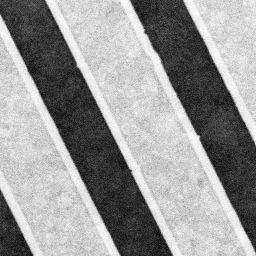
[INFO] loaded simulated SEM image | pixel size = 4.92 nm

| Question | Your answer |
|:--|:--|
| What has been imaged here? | one or a few lines or trenches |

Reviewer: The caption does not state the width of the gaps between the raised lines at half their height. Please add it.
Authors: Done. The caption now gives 0.27 microns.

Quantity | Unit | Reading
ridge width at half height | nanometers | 332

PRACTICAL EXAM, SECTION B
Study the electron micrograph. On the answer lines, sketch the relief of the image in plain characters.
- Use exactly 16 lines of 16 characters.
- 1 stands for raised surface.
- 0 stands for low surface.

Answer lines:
0001111100001111
0000111110000111
0000111110000111
1000011111000011
1000011111000011
1100001111100001
1100001111100001
1110000111110000
1110000111110000
1111000011111000
1111000011111000
1111100001111100
0111100001111100
0111110000111110
0011110000111110
0011111000011111